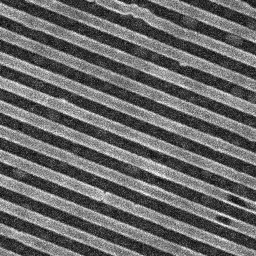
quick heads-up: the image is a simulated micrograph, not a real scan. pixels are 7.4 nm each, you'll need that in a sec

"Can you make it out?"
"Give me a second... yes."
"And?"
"parallel lines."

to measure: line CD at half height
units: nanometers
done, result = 77.3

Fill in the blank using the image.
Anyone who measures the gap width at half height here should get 0.0902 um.